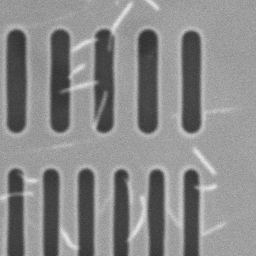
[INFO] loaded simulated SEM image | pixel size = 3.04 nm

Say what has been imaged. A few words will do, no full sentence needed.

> groups of lines, slits or small figures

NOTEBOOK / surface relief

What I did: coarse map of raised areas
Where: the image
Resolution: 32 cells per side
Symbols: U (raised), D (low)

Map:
UUUUUUUUUUUUUUUUUUUUUUUUUUUUUUUU
UUUUUUUUUUUUUUUUUUUUUUUUUUUUUUUU
UUUUUUUUUUUUUUUUUUUUUUUUUUUUUUUU
UUUUUUUDUUUUUUUUUUDUUUUUUUUUUUUU
UDDUUUDDDUUUDDUUUDDDUUUDDUUUUUUU
UDDUUUDDDUUUDDUUUDDDUUUDDUUUUUUU
UDDUUUDDDUUUDDUUUDDDUUDDDUUUUUUU
UDDUUUDDDUUUDDUUUDDDUUUDDUUUUUUU
UDDUUUDDDUUUDDUUUDDDUUUDDUUUUUUU
UDDDUUDDDUUUDDUUUDDDUUUDDUUUUUUU
UDDDUUDDDUUUDDUUUDDDUUUDDUUUUUUU
UDDDUUDDDUUUDDUUUDDDUUUDDUUUUUUU
UDDDUUDDDUUUDDUUUDDDUUUDDUUUUUUU
UDDUUUDDDUUUDDUUUDDDUUUDDUUUUUUU
UDDUUUDDDUUUDDUUUDDDUUUDDUUUUUUU
UDDUUUDDDUUUDDUUUDDDUUUDDUUUUUUU
UDDUUUUDUUUUDDUUUUDUUUUDDUUUUUUU
UUUUUUUUUUUUUUUUUUUUUUUUUUUUUUUU
UUUUUUUUUUUUUUUUUUUUUUUUUUUUUUUU
UUUUUUUUUUUUUUUUUUUUUUUUUUUUUUUU
UUUUUUUUUUUUUUUUUUUUUUUUUUUUUUUU
UDDUUDDUUUDDUUDDUUUDUUUDDUUUUUUU
UDDUUDDDUUDDUUDDUUDDDUUDDUUUUUUU
UDDUUDDDUUDDUUDDUUDDDUUDDUUUUUUU
UDDUUDDDUUDDUUDDUUDDDUUDDUUUUUUU
UDDUUDDDUUDDUUDDUUDDDUUDDUUUUUUU
UDDUUDDDUUDDUUDDUUDDDUUDDUUUUUUU
UDDUUDDDUUDDUUDDUUDDDUUDDUUUUUUU
UDDUUDDDUUDDUUDDUUDDDUUDDUUUUUUU
UDDUUDDDUUDDUUDDUUDDDUUDDUUUUUUU
UDDUUDDDUUDDUUDDUUDDDUUDDUUUUUUU
UDDUUDDUUUDDUUDDUUDDDUUDDUUUUUUU